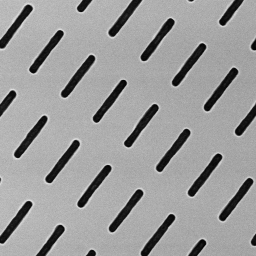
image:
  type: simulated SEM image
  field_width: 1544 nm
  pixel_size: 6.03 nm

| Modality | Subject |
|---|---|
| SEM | a regular array of holes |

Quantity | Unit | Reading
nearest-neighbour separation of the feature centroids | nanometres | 242